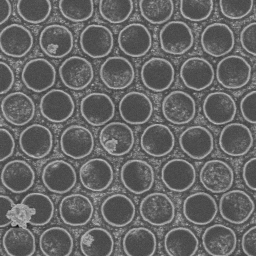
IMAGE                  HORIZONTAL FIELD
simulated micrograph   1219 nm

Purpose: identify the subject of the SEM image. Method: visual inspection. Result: a regular array of raised bodies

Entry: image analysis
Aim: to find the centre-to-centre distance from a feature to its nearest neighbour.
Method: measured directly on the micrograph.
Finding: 178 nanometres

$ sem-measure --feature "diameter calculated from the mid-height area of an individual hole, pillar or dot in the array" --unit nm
154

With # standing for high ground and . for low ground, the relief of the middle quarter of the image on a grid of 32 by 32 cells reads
#######...#######...#######...##
#######..########...#######..###
#######..########...#######..###
#######...#######...#######...##
######....#######...#######...##
.####......#####.....#####.....#
................................
#...............###........###..
##...######....######.....######
##...#######..#######....#######
##..########..########...#######
##..########..########...#######
##...#######..########...#######
#....#######...######.....######
......####......####.......####.
...........#####......###.......
.#####....#######...######.....#
#######..########...#######...##
#######..########...#######..###
#######..########...#######..###
#######...#######...#######..###
#######....#####....#######...##
.#####......###.......###......#
..##............................
......####......###.......#####.
##...######....######....#######
##..#.######...#######...#######
###.########..########...#######
###.########..########...#######
###..#######...#######...#######
##...######....#######....######
#......##........###........##..